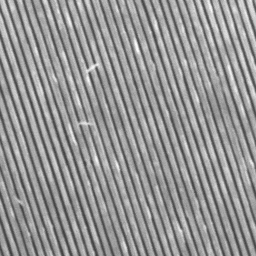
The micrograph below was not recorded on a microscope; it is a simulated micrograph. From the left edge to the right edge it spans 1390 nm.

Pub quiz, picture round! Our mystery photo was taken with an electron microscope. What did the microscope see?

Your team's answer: parallel lines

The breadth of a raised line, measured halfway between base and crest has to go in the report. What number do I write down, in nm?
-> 27.8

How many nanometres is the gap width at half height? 18.1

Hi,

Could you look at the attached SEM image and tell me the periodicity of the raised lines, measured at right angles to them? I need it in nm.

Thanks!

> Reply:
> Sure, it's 43.9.